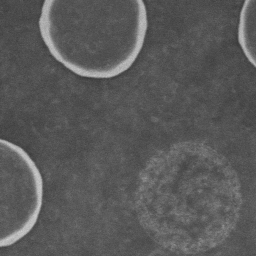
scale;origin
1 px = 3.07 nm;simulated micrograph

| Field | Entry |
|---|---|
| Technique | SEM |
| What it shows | raised bodies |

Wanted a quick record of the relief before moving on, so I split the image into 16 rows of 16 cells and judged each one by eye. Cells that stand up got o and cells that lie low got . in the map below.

...oooooo......o
...oooooo......o
...oooooo......o
....oooo........
.....oo.........
................
................
................
................
o...............
oo..............
oo..............
oo..............
oo..............
o...............
................